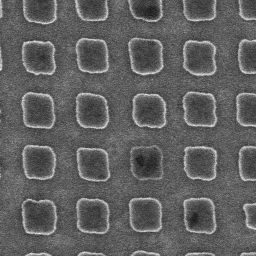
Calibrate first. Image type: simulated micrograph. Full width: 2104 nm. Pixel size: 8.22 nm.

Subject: a regular array of raised bodies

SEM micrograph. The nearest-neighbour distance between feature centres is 426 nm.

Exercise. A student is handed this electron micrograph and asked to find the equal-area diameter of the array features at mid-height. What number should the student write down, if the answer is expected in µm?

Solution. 0.291